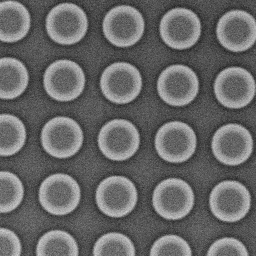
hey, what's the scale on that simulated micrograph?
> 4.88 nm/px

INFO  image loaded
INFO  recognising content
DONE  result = an array of small figures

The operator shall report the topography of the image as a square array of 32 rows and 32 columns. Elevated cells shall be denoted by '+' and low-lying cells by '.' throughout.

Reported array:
++......+.......................
+++...++++....+++....+++.....++.
++++..+++++..+++++..+++++...++++
++++..+++++..+++++..+++++..+++++
+++...++++...+++++..+++++..+++++
..............+++....+++....++++
................................
++..............................
+++...++++...++++....+++.....+..
+++...++++...+++++..++++...++++.
+++...++++...+++++..+++++..+++++
+++...++++...++++...+++++..+++++
.......++.....++....++++...++++.
................................
++..............................
+++...++++...+++.....++.........
+++..+++++...++++...++++...++++.
+++..+++++..+++++..+++++...++++.
+++...++++...++++...++++...++++.
.......++....+++....++++...++++.
............................++..
................................
++....+++....+++.....++.........
+++..+++++..+++++...++++...++++.
+++..+++++..+++++..+++++..+++++.
++...+++++..+++++..+++++..+++++.
......+++....+++....++++...++++.
............................++..
................................
++...++++....+++.....+..........
++...++++...++++...++++....+++..
+++..+++++..+++++..+++++..+++++.